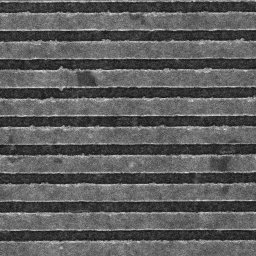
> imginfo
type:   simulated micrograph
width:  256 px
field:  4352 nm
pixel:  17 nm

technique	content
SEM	parallel lines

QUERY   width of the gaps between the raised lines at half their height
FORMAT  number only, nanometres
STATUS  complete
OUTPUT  189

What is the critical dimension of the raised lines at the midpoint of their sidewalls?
291 nm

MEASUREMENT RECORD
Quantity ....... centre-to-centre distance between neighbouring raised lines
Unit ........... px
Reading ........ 28.6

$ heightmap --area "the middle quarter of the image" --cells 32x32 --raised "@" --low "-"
--------------------------------
@@@@@@@@@@----@@@@@@-@---@@--@-@
@@@@@@@@@@@@@@@@@@@@@@@@@@@@@@@@
@@@@@@@@@@@@@@@@@@@@@@@@@@@@@@@@
@@@@@@@@@@@@@@@@@@@@@@@@@@@@@@@@
@@@@@@@@@@@@@-@@@@@@@@@@@-@@@@@@
--------------------------------
--------------------------------
------------@@@@-------@--@@@-@@
@@@@@@@@@@@@@@@@@@@@@@@@@@@@@@@@
@@@@@@@@@@@@@@@@@@@@@@@@@@@@@@@@
@@@@@@@@@@@@@@@@@@@@@@@@@@@@@@@@
@@@@@@@@@@@@@@@@@@@@@@@@@@@@@@@@
--------------------------------
--------------------------------
------------------------@-------
@@@@@@@@@@@@@@@@@@@@@@@@@@@@@@@@
@@@@@@@@@@@@@@@@@@@@@@@@@@@@@@@@
@@@@@@@@@@@@@@@@@@@@@@@@@@@@@@@@
@@@@@@@@@@@@@@@@@@@@@@@@@@@@@@@@
--------------------------------
--------------------------------
--------------------------------
@@@@@@@@@@@@@@@@@@@@@@@@@@@@@@@@
@@@@@@@@@@@@@@@@@@@@@@@@@@@@@@@@
@@@@@@@@@@@@@@@@@@@@@@@@@@@@@@@@
@@@@@@@@@@@@@@@@@@@@@@@@@@@@@@@@
--------------------------------
--------------------------------
--------------------------------
@@@@@@@@@@@@@@@@@@@@@@@@@@@@@@@@
@@@@@@@@@@@@@@@@@@@@@@@@@@@@@@@@